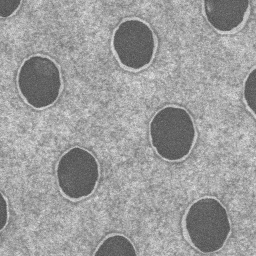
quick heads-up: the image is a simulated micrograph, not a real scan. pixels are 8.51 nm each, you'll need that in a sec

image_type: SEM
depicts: holes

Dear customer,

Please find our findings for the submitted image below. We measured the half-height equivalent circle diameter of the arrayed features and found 0.402 microns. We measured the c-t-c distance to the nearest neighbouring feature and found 836 nm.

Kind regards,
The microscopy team